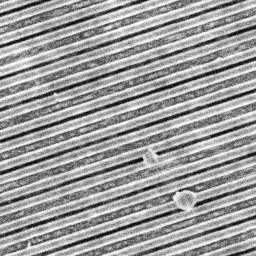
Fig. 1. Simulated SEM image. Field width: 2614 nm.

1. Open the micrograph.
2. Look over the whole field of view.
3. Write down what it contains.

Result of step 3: parallel lines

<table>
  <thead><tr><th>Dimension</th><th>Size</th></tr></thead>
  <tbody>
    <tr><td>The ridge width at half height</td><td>77.7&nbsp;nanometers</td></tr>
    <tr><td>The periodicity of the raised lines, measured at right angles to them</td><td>0.153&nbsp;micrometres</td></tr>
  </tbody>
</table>